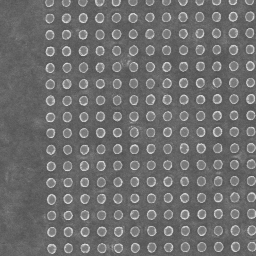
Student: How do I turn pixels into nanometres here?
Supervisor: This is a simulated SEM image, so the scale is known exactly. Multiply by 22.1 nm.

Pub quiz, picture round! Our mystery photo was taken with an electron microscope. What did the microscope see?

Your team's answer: a regular array of raised bodies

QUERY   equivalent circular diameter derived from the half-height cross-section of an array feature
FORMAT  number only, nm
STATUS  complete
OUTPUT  203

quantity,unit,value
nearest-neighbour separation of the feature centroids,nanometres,360